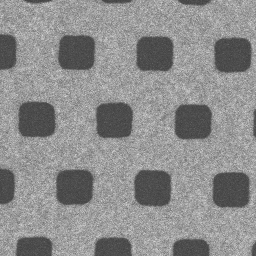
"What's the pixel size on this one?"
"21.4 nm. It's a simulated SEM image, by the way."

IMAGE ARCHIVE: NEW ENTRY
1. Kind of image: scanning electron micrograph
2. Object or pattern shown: a regular array of holes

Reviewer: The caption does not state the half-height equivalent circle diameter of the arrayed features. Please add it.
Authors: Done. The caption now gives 834 nm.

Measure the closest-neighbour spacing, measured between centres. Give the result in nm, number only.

1660